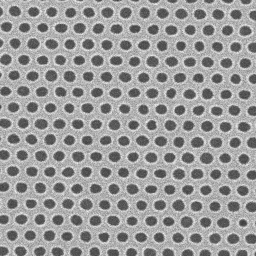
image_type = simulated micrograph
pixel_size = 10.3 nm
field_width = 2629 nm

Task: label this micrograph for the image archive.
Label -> a regular array of holes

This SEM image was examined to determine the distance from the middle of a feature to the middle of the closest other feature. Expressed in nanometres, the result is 185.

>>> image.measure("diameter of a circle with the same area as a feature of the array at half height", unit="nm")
116